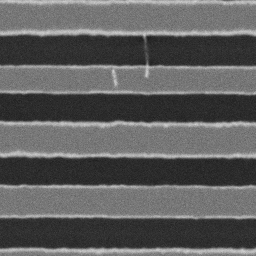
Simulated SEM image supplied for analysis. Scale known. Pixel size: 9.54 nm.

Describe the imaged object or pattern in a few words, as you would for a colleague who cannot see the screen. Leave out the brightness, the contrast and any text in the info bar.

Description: lines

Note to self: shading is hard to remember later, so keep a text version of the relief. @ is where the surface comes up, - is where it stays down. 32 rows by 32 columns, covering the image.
@@@@@@@@@@@@@@@@@@@@@@@@@@@@@@@@
@@@@@@@@@@@@@@@@@@@@@@@@@@@@@@@@
@@@@@@@@@@@@@@@@@@@@@@@@@@@@@@@@
@@@@@@@@@@@@@@@@@@@@@@@@@@@@@@@@
-----@--------------------------
--------------------------------
--------------------------------
--------------------------------
@@@@@@@@@@@@@@@@@@@@@@@@@@@@@@@@
@@@@@@@@@@@@@@@@@@@@@@@@@@@@@@@@
@@@@@@@@@@@@@@@@@@@@@@@@@@@@@@@@
@@@@@@@@@@@@@@@@@@@@@@@@@@@@@@@@
--------------------------------
--------------------------------
--------------------------------
@@@@@@@@@@@@@@@@@@@@@@@@@@@@@@@@
@@@@@@@@@@@@@@@@@@@@@@@@@@@@@@@@
@@@@@@@@@@@@@@@@@@@@@@@@@@@@@@@@
@@@@@@@@@@@@@@@@@@@@@@@@@@@@@@@@
@@@@@@@@@@@@@@@@@@@@@@@@@@@@@@@@
--------------------------------
--------------------------------
--------------------------------
@@@@@@@@@@@@@@@@@@@@@@@@@@@@@@@@
@@@@@@@@@@@@@@@@@@@@@@@@@@@@@@@@
@@@@@@@@@@@@@@@@@@@@@@@@@@@@@@@@
@@@@@@@@@@@@@@@@@@@@@@@@@@@@@@@@
--------------------------------
--------------------------------
--------------------------------
--------------------------------
@@@@@@@@@@@@@@@@@@@@@@@@@@@@@@@@